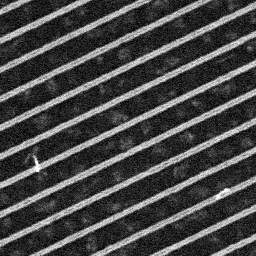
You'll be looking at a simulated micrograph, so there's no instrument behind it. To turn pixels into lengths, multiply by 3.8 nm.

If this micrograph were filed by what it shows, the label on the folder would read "parallel lines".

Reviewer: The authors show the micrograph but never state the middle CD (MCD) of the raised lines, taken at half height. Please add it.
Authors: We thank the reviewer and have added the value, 14.2 nm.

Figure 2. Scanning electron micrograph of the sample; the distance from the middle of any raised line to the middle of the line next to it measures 99.1 nanometers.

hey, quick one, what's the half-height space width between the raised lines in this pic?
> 0.0848 microns